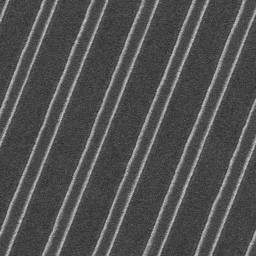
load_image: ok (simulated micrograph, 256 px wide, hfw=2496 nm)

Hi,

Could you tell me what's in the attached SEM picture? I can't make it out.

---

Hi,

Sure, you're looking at lines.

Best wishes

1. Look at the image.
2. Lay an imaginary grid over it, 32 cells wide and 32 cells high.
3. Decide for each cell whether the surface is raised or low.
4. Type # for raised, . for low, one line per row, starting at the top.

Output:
#....##....##.....##....##....##
.....##....##....##.....##....##
....##....###....##....##....###
....##....##....###....##....##.
....#.....##....##....##.....##.
...##....##.....##....##....##..
...##....##....##.....##....##..
..##.....##....##....##....###..
..##....##.....#.....##....##...
..##....##....##.....#.....##...
.##....##.....##....##....##....
.##....##....##.....##....##....
##....###....##....##.....##....
##....##.....##....##....##....#
##....##....##....##.....##....#
#....##.....##....##....##.....#
#....##....##.....##....##....##
.....##....##....##.....##....##
....##.....##....##....##.....##
....##....##....##.....##....##.
...##.....##....##....###....##.
...##....##.....##....##....###.
...##....##....##.....##....##..
..##.....##....##....##.....##..
..##....##.....#.....##....##...
.###....##....##....##.....##...
.##....##.....##....##....###...
.##....##....##.....##....##....
##.....##....##....##.....##....
##....##.....##....##....##.....
##....##....##....###....##....#
#....##.....##....##.....##....#